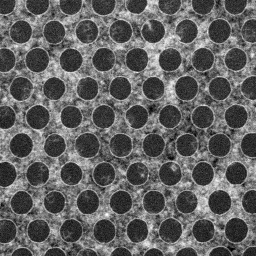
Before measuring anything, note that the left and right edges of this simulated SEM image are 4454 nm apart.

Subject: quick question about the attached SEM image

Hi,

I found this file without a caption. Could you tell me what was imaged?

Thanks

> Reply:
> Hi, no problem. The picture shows a regular array of raised bodies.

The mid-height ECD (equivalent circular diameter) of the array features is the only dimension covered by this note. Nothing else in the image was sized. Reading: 0.421 um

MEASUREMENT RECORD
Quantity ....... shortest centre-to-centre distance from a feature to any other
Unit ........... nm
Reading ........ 567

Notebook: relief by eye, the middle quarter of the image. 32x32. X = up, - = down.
XXXX---XXXXXX---XXXXX---XXXXX---
XXXX----XXXX-----XXX-----XXX----
--------------------------------
-----XX------XXX-----XXX-----XXX
----XXXX----XXXX----XXXXX---XXXX
---XXXXXX--XXXXXX---XXXXX---XXXX
---XXXXXX--XXXXXX---XXXXX---XXXX
---XXXXX----XXXXX---XXXXX---XXXX
----XXXX----XXXX-----XXX-----XXX
--------------------------------
-X-------XX------XX------XXX----
XXXX---XXXXX----XXXXX---XXXXX---
XXXXX--XXXXXX--XXXXXX---XXXXX---
XXXXX--XXXXXX--XXXXXX---XXXXX---
XXXX---XXXXXX---XXXXX---XXXXX---
XXXX----XXXX----XXXX-----XXX----
--------------------------------
----XXX------XX------XX-------XX
---XXXXX----XXXXX---XXXXX---XXXX
---XXXXXX--XXXXXX---XXXXX---XXXX
---XXXXXX--XXXXXX---XXXXX---XXXX
---XXXXXX---XXXXX---XXXXX---XXXX
---XXXXX----XXXX----XXXX-----XXX
-----XX-------------------------
--------------------------X-----
XXXX----XXXX----XXXXX---XXX-X---
XXXX---XXXXXX---XXXXX---XXX-----
XXXXX--XXXXXX---XXX-X---XXXXX---
XXXXX--XXXXXX---XXXXX---XXXXX---
XXXX----XXXX----XXXXX---XXXXX---
---------XX---------------------
-----XX-------------------------